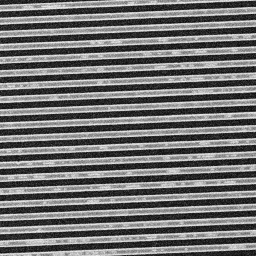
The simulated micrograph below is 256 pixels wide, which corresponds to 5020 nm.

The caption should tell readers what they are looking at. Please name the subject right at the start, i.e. parallel lines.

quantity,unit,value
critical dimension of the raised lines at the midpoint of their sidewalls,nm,93.1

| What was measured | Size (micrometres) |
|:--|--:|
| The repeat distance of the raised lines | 0.257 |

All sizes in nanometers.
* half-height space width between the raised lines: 149